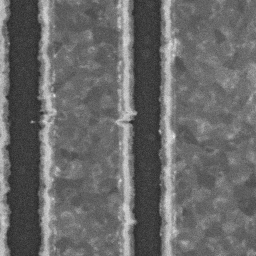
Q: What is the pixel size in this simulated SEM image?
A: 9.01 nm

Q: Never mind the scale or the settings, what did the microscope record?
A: one or a few lines or trenches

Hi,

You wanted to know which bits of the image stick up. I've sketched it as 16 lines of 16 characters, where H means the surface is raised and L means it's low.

LLLHHHHHLLHHHHHH
LLLHHHHHLLHHHHHH
LLLHHHHHLLHHHHHH
LLLHHHHHLLLHHHHH
LLLHHHHHLLHHHHHH
LLLHHHHHLLHHHHHH
LLLHHHHHLLHHHHHH
LLLHHHHHLLHHHHHH
LLLHHHHHLLLHHHHH
LLLHHHHHLLLHHHHH
LLLHHHHHLLHHHHHH
LLLHHHHHLLLHHHHH
LLLHHHHHLLLHHHHH
LLLHHHHHLLLHHHHH
LLLHHHHHLLLHHHHH
LLLHHHHHLLLHHHHH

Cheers